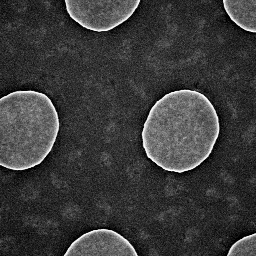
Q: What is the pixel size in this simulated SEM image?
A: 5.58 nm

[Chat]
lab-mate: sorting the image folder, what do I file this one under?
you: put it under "raised bodies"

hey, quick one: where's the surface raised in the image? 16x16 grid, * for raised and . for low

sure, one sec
....****......**
.....**........*
................
................
................
................
***.......***...
****.....*****..
****.....*****..
***......****...
.*........**....
................
................
................
......*.........
....****.......*